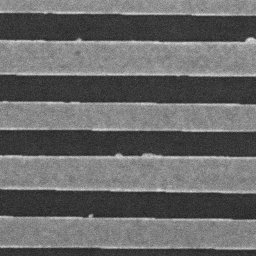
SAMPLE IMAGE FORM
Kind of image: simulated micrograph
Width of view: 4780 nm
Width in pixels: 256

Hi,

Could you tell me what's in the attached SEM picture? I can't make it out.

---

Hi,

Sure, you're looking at lines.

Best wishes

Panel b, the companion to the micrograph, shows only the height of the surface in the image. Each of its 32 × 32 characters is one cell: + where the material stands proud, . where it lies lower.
++++++++++++++++++++++++++++++++
++++++++++++++++++++++++++++++++
................................
................................
................................
++++++++++++++++++++++++++++++++
++++++++++++++++++++++++++++++++
++++++++++++++++++++++++++++++++
++++++++++++++++++++++++++++++++
................................
................................
................................
................................
++++++++++++++++++++++++++++++++
++++++++++++++++++++++++++++++++
++++++++++++++++++++++++++++++++
................................
................................
................................
................................
++++++++++++++++++++++++++++++++
++++++++++++++++++++++++++++++++
++++++++++++++++++++++++++++++++
++++++++++++++++++++++++++++++++
................................
................................
................................
++++++++++++++++++++++++++++....
++++++++++++++++++++++++++++++++
++++++++++++++++++++++++++++++++
++++++++++++++++++++++++++++++++
................................